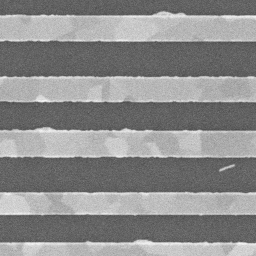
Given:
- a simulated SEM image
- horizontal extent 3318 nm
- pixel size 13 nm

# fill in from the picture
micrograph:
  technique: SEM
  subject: lines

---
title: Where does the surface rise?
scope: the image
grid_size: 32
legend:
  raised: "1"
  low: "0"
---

00000000000000000000000000000000
00000000000000000000000000000000
11111111111111111111111111111111
11111111111111111111111111111111
11111111111111111111111111111111
00000000000000000000000000000000
00000000000000000000000000000000
00000000000000000000000000000000
00000000000000000000000000000000
00000000000000000000000000000000
11111111111111111111111111111111
11111111111111111111111111111111
11111111111111111111111111111111
00000000000000000000000000000000
00000000000000000000000000000000
00000000000000000000000000000000
11111111111111111111111111111111
11111111111111111111111111111111
11111111111111111111111111111111
11111111111110111111111111111111
00000000000000000000000000000000
00000000000000000000000000000000
00000000000000000000000000000000
00000000000000000000000000000000
11111111111111111111111111111111
11111111111111111111111111111111
11111111111111111111111111111111
00000000000000000000000000000000
00000000000000000000000000000000
00000000000000000000000000000000
11111111111111111111111111111110
11111111111111111111111111111111